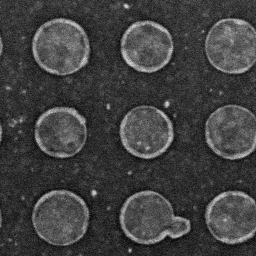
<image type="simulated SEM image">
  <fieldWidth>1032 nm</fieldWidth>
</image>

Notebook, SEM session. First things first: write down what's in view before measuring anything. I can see raised bodies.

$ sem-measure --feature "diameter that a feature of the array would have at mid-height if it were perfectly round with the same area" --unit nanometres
216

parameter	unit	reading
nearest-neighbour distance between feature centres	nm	345